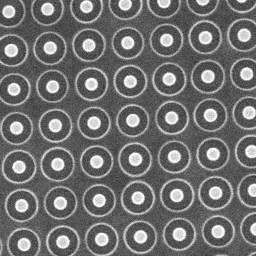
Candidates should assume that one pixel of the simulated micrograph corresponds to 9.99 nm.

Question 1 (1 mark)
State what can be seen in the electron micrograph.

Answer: an array of small figures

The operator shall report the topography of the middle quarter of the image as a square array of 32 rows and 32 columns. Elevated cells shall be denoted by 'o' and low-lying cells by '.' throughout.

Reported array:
oooooooooooooooo.ooooooo....oooo
ooooo...oooooo.....oooo......ooo
oooo......ooo.......ooo...o...oo
ooo.......ooo..ooo..oo...ooo..oo
.oo...oo...oo..ooo...o...ooo..oo
.oo...oo...oo...oo..ooo.......oo
.oo.......ooo.......ooo......ooo
oooo......oooo.....oooooo...oooo
ooooo....ooooooooooooooooooooooo
oooooooooooooooooooooooooo.ooooo
oooooooooooooooo..oooooo.....ooo
oooooo...oooooo.....oooo......oo
oooo.......ooo.......oo...oo...o
.ooo...o...oo...ooo..oo..ooo...o
..oo..ooo..oo...ooo..oo...oo...o
..oo..ooo..ooo...o...ooo......oo
..oo.......ooo......oooo......oo
.oooo.....ooooo....ooooooooooooo
oooooo...ooooooooooooooooooooooo
ooooooooooooooooooooooooooo..ooo
oooooooooooooooo....ooooo.....oo
oooooo.....oooo......ooo.......o
.oooo......ooo...o...ooo..ooo..o
..oo...oo...oo..ooo...oo..ooo..o
..oo...ooo..oo..ooo...oo...o...o
..ooo..oo...oo.......ooo.......o
..ooo......oooo......ooooo....oo
..oooo....oooooo....oooooooooooo
oooooooooooooooooooooooooooooooo
oooooooooooooooooo.ooooooo.....o
oooooooo..oooooo.....oooo.......
.ooooo......ooo.......ooo..oo...